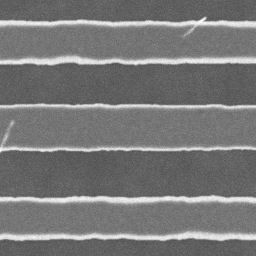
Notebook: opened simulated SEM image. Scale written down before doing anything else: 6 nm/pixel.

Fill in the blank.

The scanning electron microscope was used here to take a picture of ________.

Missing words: lines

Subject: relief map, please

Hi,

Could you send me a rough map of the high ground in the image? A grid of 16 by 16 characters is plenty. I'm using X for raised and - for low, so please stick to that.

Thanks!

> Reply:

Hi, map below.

----------------
XXXXXXXXXXXXXXXX
XXXXXXXXXXXXXXXX
XXXXXXXXXXXXXXXX
----------------
----------------
----------------
XXXXXXXXXXXXXXXX
XXXXXXXXXXXXXXXX
----------------
----------------
----------------
XXXXXXXXXXXXXXXX
XXXXXXXXXXXXXXXX
XXXXXXXXXXXXXXXX
----------------